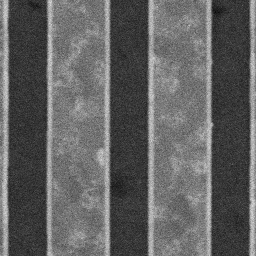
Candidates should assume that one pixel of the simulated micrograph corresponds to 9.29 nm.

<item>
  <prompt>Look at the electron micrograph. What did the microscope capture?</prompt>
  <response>one or a few lines or trenches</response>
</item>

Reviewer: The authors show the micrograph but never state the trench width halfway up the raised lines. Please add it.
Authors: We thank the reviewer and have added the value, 405 nm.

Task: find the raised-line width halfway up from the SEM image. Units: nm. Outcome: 538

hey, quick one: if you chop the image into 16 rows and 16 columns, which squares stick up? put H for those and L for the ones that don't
LLLHHHHLLHHHHLLL
LLLHHHHLLHHHHLLL
LLLHHHHLLHHHHLLL
LLLHHHHLLHHHHLLL
LLLHHHHLLHHHHLLL
LLLHHHHLLHHHHLLL
LLLHHHHLLHHHHLLL
LLLHHHHLLHHHHLLL
LLLHHHHLLHHHHLLL
LLLHHHHLLHHHHLLL
LLLHHHHLLHHHHLLL
LLLHHHHLLHHHHLLL
LLLHHHHLLHHHHLLL
LLLHHHHLLHHHHLLL
LLLHHHHLLHHHHLLL
LLLHHHHLLHHHHLLL